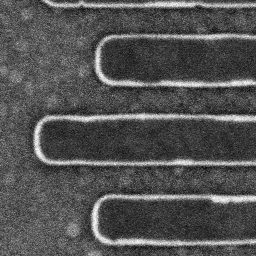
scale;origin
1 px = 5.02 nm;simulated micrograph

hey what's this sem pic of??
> one or a few lines or trenches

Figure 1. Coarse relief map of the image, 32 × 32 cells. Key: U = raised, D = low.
DDDDDDUUUUUUUUUUUUUUUUUUUUUUUUUU
DDDDDDDDDDDDDDDDDDDDDDDDDDDDDDDD
DDDDDDDDDDDDDDDDDDDDDDDDDDDDDDDD
DDDDDDDDDDDDDDDDDDDDDDDDDDDDDDDD
DDDDDDDDDDDDDDUUUUUUUDDDDDUUUUDD
DDDDDDDDDDDDDUUUUUUUUUUUUUUUUUUU
DDDDDDDDDDDDUUUUUUUUUUUUUUUUUUUU
DDDDDDDDDDDDUUUUUUUUUUUUUUUUUUUU
DDDDDDDDDDDDUUUUUUUUUUUUUUUUUUUU
DDDDDDDDDDDDDUUUUUUUUUUUUUUUUUUU
DDDDDDDDDDDDDDDUUUUUUUUUUUUUUUUD
DDDDDDDDDDDDDDDDDDDDDDDDDDDDDDDD
DDDDDDDDDDDDDDDDDDDDDDDDDDDDDDDD
DDDDDDDDDDDDDDDDDDDDDDDDDDDDDDDD
DDDDDDDDDDDDDDDUUUUUUUUDDDDDDDDD
DDDDDUUUUUUUUUUUUUUUUUUUUUUUUUUU
DDDDUUUUUUUUUUUUUUUUUUUUUUUUUUUU
DDDDUUUUUUUUUUUUUUUUUUUUUUUUUUUU
DDDDDUUUUUUUUUUUUUUUUUUUUUUUUUUU
DDDDDUUUUUUUUUUUUUUUUUUUUUUUUUUU
DDDDDDDDDDDDDDDDDDDDDDDDDDDDDDDD
DDDDDDDDDDDDDDDDDDDDDDDDDDDDDDDD
DDDDDDDDDDDDDDDDDDDDDDDDDDDDDDDD
DDDDDDDDDDDDDDDDDDDDDDDDDDDDDDDD
DDDDDDDDDDDDDUUDDDDDDDDDDDDDDDDD
DDDDDDDDDDDDUUUUUUUUUUUUUUUUUUUU
DDDDDDDDDDDDUUUUUUUUUUUUUUUUUUUU
DDDDDDDDDDDDUUUUUUUUUUUUUUUUUUUU
DDDDDDDDDDDDUUUUUUUUUUUUUUUUUUUU
DDDDDDDDDDDDUUUUUUUUUUUUUUUUUUUU
DDDDDDDDDDDDDDDDDDDDDDDDDDDDDDDD
DDDDDDDDDDDDDDDDDDDDDDDDDDDDDDDD